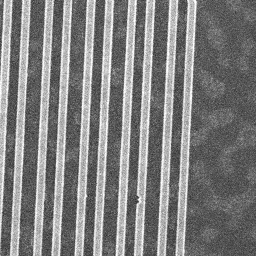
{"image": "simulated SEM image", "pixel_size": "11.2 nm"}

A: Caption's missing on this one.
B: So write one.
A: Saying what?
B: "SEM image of parallel lines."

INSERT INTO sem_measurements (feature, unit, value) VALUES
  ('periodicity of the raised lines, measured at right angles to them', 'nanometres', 231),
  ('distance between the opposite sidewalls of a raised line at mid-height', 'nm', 84.1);